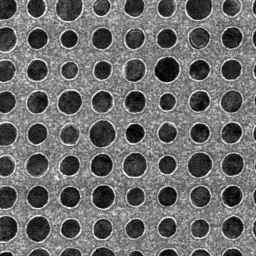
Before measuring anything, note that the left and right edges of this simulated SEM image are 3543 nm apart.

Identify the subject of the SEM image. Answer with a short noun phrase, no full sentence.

a regular array of holes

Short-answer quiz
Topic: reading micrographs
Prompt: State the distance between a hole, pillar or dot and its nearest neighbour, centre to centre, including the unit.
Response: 0.437 um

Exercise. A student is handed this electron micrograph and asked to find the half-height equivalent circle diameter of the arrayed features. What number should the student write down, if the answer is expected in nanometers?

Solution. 294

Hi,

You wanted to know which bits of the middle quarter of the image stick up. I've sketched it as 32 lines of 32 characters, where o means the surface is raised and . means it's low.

...ooooo....ooo.....ooo......oo.
....ooo.....ooo......oo......oo.
...oooo.....ooo.....ooo......oo.
...ooooo...oooo.....ooo.....oooo
ooooooooooooooooo.ooooooo..ooooo
oooooooooooooooooooooooooooooooo
o.oooooooooooooooooooooooooooooo
....oooo....oooo....ooooo..ooooo
....ooo.....ooo.....oooo....oooo
.....oo.....ooo......ooo....ooo.
....ooo.....ooo.....oooo....ooo.
....oooo...ooooo....ooooo..ooooo
..oooooooooooooooooooooooooooooo
oooooooooooooooooooooooooooooooo
oooooooo...oooooooooooooo.oooooo
...oooo.....oooo...ooooo....oooo
....oo.......ooo....oooo....oooo
....oo.......oo.....ooo.....ooo.
....oo.......oo.....oooo....oooo
...oooo.....oooo...oooooo..ooooo
oooooooo...ooooooooooooooooooooo
oooooooooooooooooooooooooooooooo
ooooooooo..oooooo..ooooooooooooo
...oooo.....ooo.....oooo...oooo.
....ooo.....ooo......ooo....ooo.
....ooo.....ooo......oo.....ooo.
....ooo.....ooo......ooo....ooo.
...oooo....oooo.....ooooo..ooooo
oooooooooooooooooooooooooooooooo
oooooooooooooooooooooooooooooooo
oooooooo...ooooooooooooooooooooo
....ooo.....oooo....oooo....oooo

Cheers